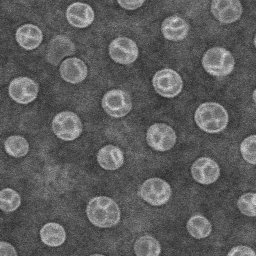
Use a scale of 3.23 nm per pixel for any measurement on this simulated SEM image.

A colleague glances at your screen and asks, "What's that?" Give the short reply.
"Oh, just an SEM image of a regular array of raised bodies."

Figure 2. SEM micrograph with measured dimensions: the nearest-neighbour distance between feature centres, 175 nm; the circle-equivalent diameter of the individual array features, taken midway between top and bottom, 0.0861 µm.